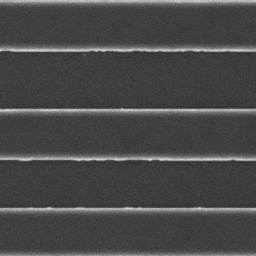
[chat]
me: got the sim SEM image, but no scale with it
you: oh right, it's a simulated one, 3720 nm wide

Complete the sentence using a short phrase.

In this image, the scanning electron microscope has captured lines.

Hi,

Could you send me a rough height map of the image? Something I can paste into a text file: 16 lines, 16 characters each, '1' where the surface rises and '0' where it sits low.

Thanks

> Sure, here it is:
1111111111111111
1111111111111111
1111111111111111
0000000000000000
0000000000000000
0000000000000000
0000000000000000
1111111111111111
1111111111111111
1111111111111111
0000000000000000
0000000000000000
0000000000000000
1111111111111111
1111111111111111
1111111111111111